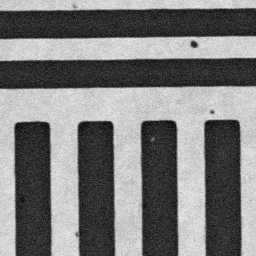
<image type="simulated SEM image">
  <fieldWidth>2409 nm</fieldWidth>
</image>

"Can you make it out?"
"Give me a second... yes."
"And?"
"groups of lines, slits or small figures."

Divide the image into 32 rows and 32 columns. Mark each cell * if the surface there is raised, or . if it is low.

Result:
********************************
................................
................................
................................
................................
********************************
********************************
**..............................
................................
................................
................................
********************************
********************************
********************************
********************************
**....****....****....****....**
**....****....****....***.....**
**....****....****....***.....**
**....****....****....***.....**
**....****....****....***.....**
**....****....****....***.....**
**....****....****....***.....**
**....****....****....***.....**
**....****....****....****....**
**....****....****....****....**
**....****....****....****....**
**....****....****....****....**
**....****....****....****....**
**....****....****....****....**
**....****....****....****....**
**....****....****....****....**
**....****....****....****....**